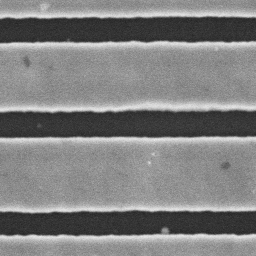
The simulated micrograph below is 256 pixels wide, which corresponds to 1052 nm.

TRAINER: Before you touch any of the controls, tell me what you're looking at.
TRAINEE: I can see lines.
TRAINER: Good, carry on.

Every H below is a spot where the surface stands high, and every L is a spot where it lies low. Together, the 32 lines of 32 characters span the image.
HHHHHHHHHHHHHHHHHHHHHHHHHHHHHHHH
HHHHHHHHHHHHHHHHHHHHHHHHHHHHHHHH
LLLLLLLLLLLLLLLLLLLLLLLLLLLLLLLL
LLLLLLLLLLLLLLLLLLLLLLLLLLLLLLLL
LLLLLLLLLLLLLLLLLLLLLLLLLLLLLLLL
HHHHHHHHHHHHHHHHHHHHHHHHHHHHHHHH
HHHHHHHHHHHHHHHHHHHHHHHHHHHHHHHH
HHHHHHHHHHHHHHHHHHHHHHHHHHHHHHHH
HHHHHHHHHHHHHHHHHHHHHHHHHHHHHHHH
HHHHHHHHHHHHHHHHHHHHHHHHHHHHHHHH
HHHHHHHHHHHHHHHHHHHHHHHHHHHHHHHH
HHHHHHHHHHHHHHHHHHHHHHHHHHHHHHHH
HHHHHHHHHHHHHHHHHHHHHHHHHHHHHHHH
HHHHHHHHHHHHHHHHHHHHHHHHHHHHHHHH
LLLLLLLLLLLLLLLLLLLLLLLLLLLLLLLL
LLLLLLLLLLLLLLLLLLLLLLLLLLLLLLLL
LLLLLLLLLLLLLLLLLLLLLLLLLLLLLLLL
HHHHHHHHHHHHHHHHHHHHHHHHHHHHHHHH
HHHHHHHHHHHHHHHHHHHHHHHHHHHHHHHH
HHHHHHHHHHHHHHHHHHHHHHHHHHHHHHHH
HHHHHHHHHHHHHHHHHHHHHHHHHHHHHHHH
HHHHHHHHHHHHHHHHHHHHHHHHHHHHHHHH
HHHHHHHHHHHHHHHHHHHHHHHHHHHHHHHH
HHHHHHHHHHHHHHHHHHHHHHHHHHHHHHHH
HHHHHHHHHHHHHHHHHHHHHHHHHHHHHHHH
HHHHHHHHHHHHHHHHHHHHHHHHHHHHHHHH
LLHHHHHLLLLLLLLLLLLLLLLLLLLLLLLL
LLLLLLLLLLLLLLLLLLLLLLLLLLLLLLLL
LLLLLLLLLLLLLLLLLLLLLLLLLLLLLLLL
HLHHHLLHHLHLLHHLHHHHHHHHHHHHHHHH
HHHHHHHHHHHHHHHHHHHHHHHHHHHHHHHH
HHHHHHHHHHHHHHHHHHHHHHHHHHHHHHHH